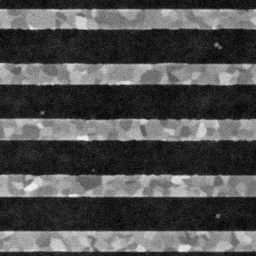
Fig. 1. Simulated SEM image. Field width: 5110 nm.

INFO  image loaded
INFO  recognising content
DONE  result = lines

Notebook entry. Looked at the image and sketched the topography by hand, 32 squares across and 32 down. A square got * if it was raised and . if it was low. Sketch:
................................
********************************
********************************
.******...*********..**.****..**
................................
................................
................................
................................
********************************
********************************
....***......**.........*****...
................................
................................
................................
................................
********************************
********************************
..........**...*....*****.**.***
................................
................................
................................
................................
********************************
********************************
********************************
................................
................................
................................
................................
********************************
********************************
................................